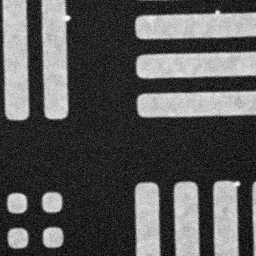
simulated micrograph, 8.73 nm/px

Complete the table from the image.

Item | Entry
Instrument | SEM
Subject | groups of lines, slits or small figures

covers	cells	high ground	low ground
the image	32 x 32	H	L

HHHLLHHHLLLLLLLLLLLLLLLLLLLLLLLL
HHHLLHHHLLLLLLLLLLLLLLLLLLLLLLLL
HHHLLHHHLLLLLLLLLHHHHHHHHHHHHHHH
HHHLLHHHLLLLLLLLLHHHHHHHHHHHHHHH
LHHLLHHHLLLLLLLLLHHHHHHHHHHHHHLL
LHHLLHHHLLLLLLLLLLLLLLLLLLLLLLLL
LHHLLHHHLLLLLLLLLLLLLLLLLLLLLLLL
LHHLLHHHLLLLLLLLLHHHHHHHHHHHHHHH
LHHLLHHHLLLLLLLLLHHHHHHHHHHHHHHH
LHHLLHHHLLLLLLLLLLHHHHHHHLLLLLLL
LHHLLLHHLLLLLLLLLLLLLLLLLLLLLLLL
LHHLLLHHLLLLLLLLLLLLLLLLLLLLLLLL
LHHLLLHHLLLLLLLLLHHHHHHHHHHHHHHH
LHHLLLHHLLLLLLLLLHHHHHHHHHHHHHHH
LHHLLLHHLLLLLLLLLLHHLLLLLLLLLLLL
LLLLLLLLLLLLLLLLLLLLLLLLLLLLLLLL
LLLLLLLLLLLLLLLLLLLLLLLLLLLLLLLL
LLLLLLLLLLLLLLLLLLLLLLLLLLLLLLLL
LLLLLLLLLLLLLLLLLLLLLLLLLLLLLLLL
LLLLLLLLLLLLLLLLLLLLLLLLLLLLLLLL
LLLLLLLLLLLLLLLLLLLLLLLLLLLLLLLL
LLLLLLLLLLLLLLLLLLLLLLLLLLLLLLLL
LLLLLLLLLLLLLLLLLLLLLLLLLLLLLLLL
LLLLLLLLLLLLLLLLLHHHLLHHHLLHHHLL
LHHLLLHLLLLLLLLLLHHHLLHHHLLHHHLL
LHHLLHHHLLLLLLLLLHHHLLHHHLLHHHLL
LLHLLLLLLLLLLLLLLHHHLLHHHLLHHHLL
LLLLLLLLLLLLLLLLLHHHLLHHHLLHHHLL
LLLLLLLLLLLLLLLLLHHHLLHHHLLHHHLL
LHHLLHHHLLLLLLLLLHHHLLHHHLLHHHLL
LHHLLLHHLLLLLLLLLHHHLLHHHLLHHHLL
LLLLLLLLLLLLLLLLLHHHLLHHHLLHHHLL